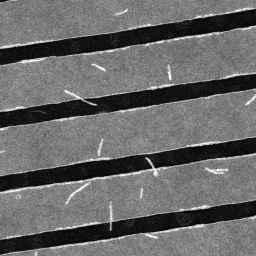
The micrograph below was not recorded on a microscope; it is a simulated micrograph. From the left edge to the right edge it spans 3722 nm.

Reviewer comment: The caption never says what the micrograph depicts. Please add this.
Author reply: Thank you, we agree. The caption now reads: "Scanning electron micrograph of one or a few lines or trenches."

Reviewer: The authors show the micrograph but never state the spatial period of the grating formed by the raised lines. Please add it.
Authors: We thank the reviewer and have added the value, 0.911 microns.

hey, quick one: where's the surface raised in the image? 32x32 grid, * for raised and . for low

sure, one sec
********************************
*****************************...
***********************.........
*****************.............**
***********.............********
****..............**************
............********************
...*****************************
********************************
*****************************...
***********************.........
****************..............**
*********...............********
***..............***************
...........*********************
....****************************
********************************
*****************************...
***********************.........
****************..............**
*********..............*********
***..............***************
..........**********************
...*****************************
********************************
****************************....
*********************...........
***************........*.....***
*********.............**********
***.............****************
..........**********************
..******************************